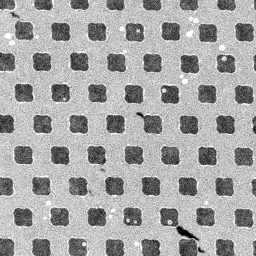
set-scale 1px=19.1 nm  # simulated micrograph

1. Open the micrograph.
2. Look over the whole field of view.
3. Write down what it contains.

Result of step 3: a regular array of raised bodies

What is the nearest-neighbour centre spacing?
0.678 µm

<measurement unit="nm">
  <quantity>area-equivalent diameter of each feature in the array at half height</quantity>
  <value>405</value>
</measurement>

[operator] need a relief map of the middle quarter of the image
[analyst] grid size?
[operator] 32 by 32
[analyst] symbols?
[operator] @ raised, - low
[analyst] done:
--@@@@-----@@@@@----@@@@@----@@@
--@@@@-----@@@@-----@@@@@----@@@
--------------------------------
--------------------------------
--------------------------------
@-----@@@@-----@@@@-----@@@@----
@-----@@@@@----@@@@@----@@@@@---
@-----@@@@@----@@@@@----@@@@@---
@@----@@@@@----@@@@@----@@@@@---
@------@@@------@@@@----@@@@@---
--------------------------------
--------------------------------
--------------------------------
-@@@@@----@@@@@-----@@@@-----@@@
-@@@@@----@@@@@-----@@@@@----@@@
-@@@@@-----@@@@-----@@@@@----@@@
-@@@@@-----@@@@-----@@@@@----@@@
-----------------------@--------
--------------------------------
--------------------------------
------@@@@------@--------@------
@-----@@@@-----@@@@@----@@@@@---
@-----@@@@-----@@@@@----@@@@@---
@-----@@@@@----@@@@@----@@@@@---
@-----@@@@@----@@@@@----@@@@@---
--------------------------------
--------------------------------
--------------------------------
-@@@@------@@@------@@@@-----@@@
-@@@@@----@@@@@----@@@@@-----@@@
-@@@@@----@@@@@-----@@@@-----@@@
-@@@@@----@@@@@----@@@@@-----@@@